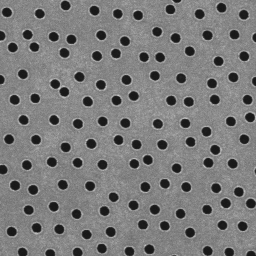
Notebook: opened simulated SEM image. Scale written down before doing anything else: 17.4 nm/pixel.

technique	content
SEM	a regular array of holes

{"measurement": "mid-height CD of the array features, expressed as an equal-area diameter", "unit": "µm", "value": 0.175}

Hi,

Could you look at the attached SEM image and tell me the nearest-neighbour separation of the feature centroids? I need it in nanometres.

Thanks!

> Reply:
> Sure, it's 340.